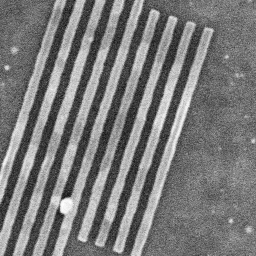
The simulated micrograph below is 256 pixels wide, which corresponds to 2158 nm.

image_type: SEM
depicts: groups of lines, slits or small figures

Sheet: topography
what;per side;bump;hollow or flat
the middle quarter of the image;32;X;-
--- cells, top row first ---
---XX---XX--XXX---X---XX---XX---
--XXX--XX---XX---XX---XX---XX---
--XX---XX---XX---XX---XX---XX--X
--XX---X----XX--XX----X---XX---X
--XX--XX---XX---XX---XX---XX---X
-XX---XX---XX---XX---XX---XX---X
-XX---XX---XX--XXX--XX---XX---XX
XXX--XXX--XX---XX---XX---XX---XX
XX---XX---XX---XX---XX---XX---X-
XX---XX---XX---XX--XXX--XX---XX-
XX--XX---XX---XX---XX---XX---XX-
X---XX---XX---XX---XX---XX---XX-
X---XX---XX---X---XXX--XX---XX--
X--XX---XX---XX---XX---XX---XX--
---XX---XX---XX---XX---XX---XX--
---XX---XX--XXX---XX--XX----X---
--XXX--XX---XX---XX---XX---XX---
--XX---XX---XX---XX---XX---X----
--XX---XX---XX---XX---XX---X----
-XX---XX---XX---XX---XX---XX----
-XX---XX---XX---XX---XX---XX----
-XX---XX---XX--XXX---XX--XX-----
XXX--XXX--XX---XX---XX---XX-----
XX---XX---XX---XX---XX---XX-----
XX---XX---XX---XX--XXX---XX-----
XX---XX--XXX--XX---XX---XX------
X---XX---XX---XX---XX---XX------
X---XX---XX---X---XXX--XX-------
X--XX---XX---XX---XX---XX-------
---XX---XX---XX---XX---XX-------
---XX---XX---XX---XX---X--------
--XXX--XX---XX---XX---XX--------